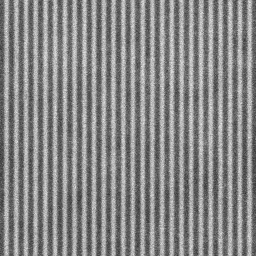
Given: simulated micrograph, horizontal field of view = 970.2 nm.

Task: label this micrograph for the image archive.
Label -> parallel lines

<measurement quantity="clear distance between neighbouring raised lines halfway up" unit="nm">24.7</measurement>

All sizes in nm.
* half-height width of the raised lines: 10.9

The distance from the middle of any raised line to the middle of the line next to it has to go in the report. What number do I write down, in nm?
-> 36.9